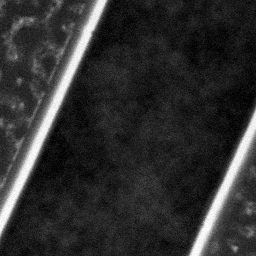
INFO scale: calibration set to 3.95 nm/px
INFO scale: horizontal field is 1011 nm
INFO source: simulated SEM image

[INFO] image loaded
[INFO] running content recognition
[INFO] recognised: one or a few lines or trenches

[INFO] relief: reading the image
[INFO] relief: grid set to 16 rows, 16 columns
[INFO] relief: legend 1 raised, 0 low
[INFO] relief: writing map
1111110000000000
1111110000000000
1111100000000000
1111100000000000
1111000000000000
1111000000000000
1110000000000000
1110000000000000
1110000000000000
1100000000000001
1100000000000001
1000000000000011
1000000000000011
0000000000000111
0000000000000111
0000000000001111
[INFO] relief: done